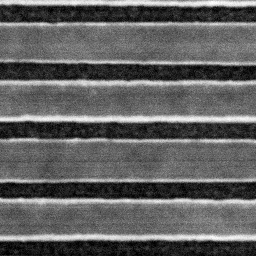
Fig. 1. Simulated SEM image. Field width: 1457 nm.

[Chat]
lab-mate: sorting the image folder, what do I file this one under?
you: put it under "lines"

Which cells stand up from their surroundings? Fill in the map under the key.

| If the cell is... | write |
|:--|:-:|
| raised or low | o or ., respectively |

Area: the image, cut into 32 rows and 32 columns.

..............oo..oooooooooooooo
................................
................................
oooooooooooooooooooooooooooooooo
oooooooooooooooooooooooooooooooo
oooooooooooooooooooooooooooooooo
oooooooooooooooooooooooooooooooo
oooooooooooooooooooooooooooooooo
................................
................................
oooooooooooooooooooooooooooooooo
oooooooooooooooooooooooooooooooo
oooooooooooooooooooooooooooooooo
oooooooooooooooooooooooooooooooo
oooooooooooooooooooooooooooooooo
................................
................................
.oooo....ooooo..................
oooooooooooooooooooooooooooooooo
oooooooooooooooooooooooooooooooo
oooooooooooooooooooooooooooooooo
oooooooooooooooooooooooooooooooo
oooooooooooooooooooooooooooooooo
................................
................................
oooooooooooooooooooooooooooooooo
oooooooooooooooooooooooooooooooo
oooooooooooooooooooooooooooooooo
oooooooooooooooooooooooooooooooo
oooooooooooooooooooooooooooooooo
................................
................................